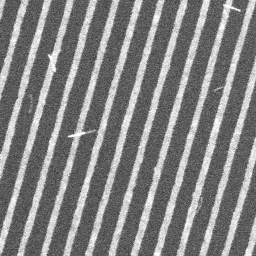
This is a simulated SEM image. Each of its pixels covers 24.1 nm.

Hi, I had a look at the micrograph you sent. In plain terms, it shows parallel lines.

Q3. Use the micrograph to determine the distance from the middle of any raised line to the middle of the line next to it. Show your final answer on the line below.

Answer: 21.9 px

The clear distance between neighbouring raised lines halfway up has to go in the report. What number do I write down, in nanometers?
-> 399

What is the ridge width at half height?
5.17 px